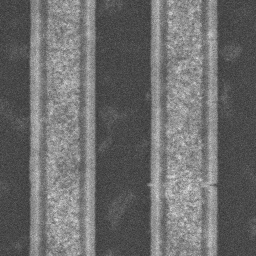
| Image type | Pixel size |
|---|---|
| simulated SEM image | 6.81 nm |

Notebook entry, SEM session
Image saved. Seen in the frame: one or a few lines or trenches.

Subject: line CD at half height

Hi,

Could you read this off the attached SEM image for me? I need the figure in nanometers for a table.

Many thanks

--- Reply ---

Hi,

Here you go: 390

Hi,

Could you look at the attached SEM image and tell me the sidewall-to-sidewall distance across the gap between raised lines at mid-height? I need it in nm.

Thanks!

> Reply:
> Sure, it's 439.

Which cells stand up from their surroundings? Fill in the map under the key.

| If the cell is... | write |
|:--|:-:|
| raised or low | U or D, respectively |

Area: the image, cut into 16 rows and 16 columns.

DDUUUUDDDDUUUDDD
DDUUUUDDDDUUUDDD
DDUUUUDDDDUUUDDD
DDUUUUDDDDUUUDDD
DDUUUUDDDDUUUDDD
DDUUUUDDDDUUUDDD
DDUUUUDDDDUUUDDD
DDUUUUDDDDUUUDDD
DDUUUUDDDDUUUDDD
DDUUUUDDDDUUUDDD
DDUUUUDDDDUUUDDD
DDUUUUDDDDUUUDDD
DDUUUUDDDDUUUDDD
DDUUUUDDDDUUUDDD
DDUUUUDDDDUUUDDD
DDUUUUDDDDUUUDDD